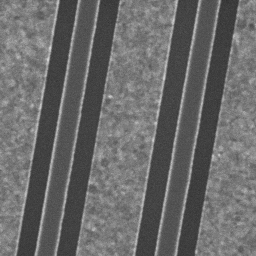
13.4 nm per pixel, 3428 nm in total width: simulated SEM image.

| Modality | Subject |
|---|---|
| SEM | lines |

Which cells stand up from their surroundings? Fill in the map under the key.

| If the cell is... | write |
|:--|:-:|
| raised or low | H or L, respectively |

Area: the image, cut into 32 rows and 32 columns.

HHHHHHHLLLHHLLLHHHHHHHLLLHHHLLHH
HHHHHHHLLLHHLLLHHHHHHHLLLHHLLLHH
HHHHHHHLLHHHLLLHHHHHHHLLHHHLLLHH
HHHHHHHLLHHHLLHHHHHHHHLLHHHLLHHH
HHHHHHHLLHHHLLHHHHHHHLLLHHHLLHHH
HHHHHHLLLHHHLLHHHHHHHLLLHHHLLHHH
HHHHHHLLLHHLLLHHHHHHHLLLHHLLLHHH
HHHHHHLLLHHLLLHHHHHHHLLLHHLLLHHH
HHHHHHLLHHHLLLHHHHHHHLLHHHLLHHHH
HHHHHHLLHHHLLHHHHHHHHLLHHHLLHHHH
HHHHHHLLHHHLLHHHHHHHLLLHHHLLHHHH
HHHHHLLLHHHLLHHHHHHHLLLHHHLLHHHH
HHHHHLLLHHLLLHHHHHHHLLLHHLLLHHHH
HHHHHLLHHHLLLHHHHHHHLLHHHLLLHHHH
HHHHHLLHHHLLLHHHHHHHLLHHHLLHHHHH
HHHHHLLHHHLLHHHHHHHHLLHHHLLHHHHH
HHHHHLLHHHLLHHHHHHHLLLHHHLLHHHHH
HHHHLLLHHHLLHHHHHHHLLLHHHLLHHHHH
HHHHLLLHHLLLHHHHHHHLLLHHLLLHHHHH
HHHHLLLHHLLLHHHHHHHLLLHHLLLHHHHH
HHHHLLHHHLLHHHHHHHHLLHHHLLHHHHHH
HHHHLLHHHLLHHHHHHHHLLHHHLLHHHHHH
HHHHLLHHHLLHHHHHHHLLLHHHLLHHHHHH
HHHLLLHHLLLHHHHHHHLLLHHHLLHHHHHH
HHHLLLHHLLLHHHHHHHLLLHHLLLHHHHHH
HHHLLHHHLLLHHHHHHHLLHHHLLLHHHHHH
HHHLLHHHLLLHHHHHHHLLHHHLLHHHHHHH
HHHLLHHHLLHHHHHHHHLLHHHLLHHHHHHH
HHHLLHHHLLHHHHHHHLLLHHHLLHHHHHHH
HHLLLHHLLLHHHHHHHLLLHHLLLHHHHHHH
HHLLLHHLLLHHHHHHHLLLHHLLLHHHHHHH
HHLLHHHLLLHHHHHHHLLHHHLLHHHHHHHH